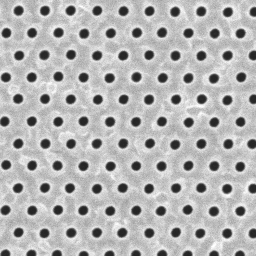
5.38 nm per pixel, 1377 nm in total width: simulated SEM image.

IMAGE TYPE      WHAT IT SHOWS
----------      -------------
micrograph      a regular array of holes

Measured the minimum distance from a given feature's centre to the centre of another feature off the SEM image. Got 136 nm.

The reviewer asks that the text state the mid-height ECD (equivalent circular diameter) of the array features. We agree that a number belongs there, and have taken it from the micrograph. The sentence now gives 53.2 nanometers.